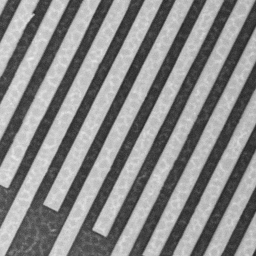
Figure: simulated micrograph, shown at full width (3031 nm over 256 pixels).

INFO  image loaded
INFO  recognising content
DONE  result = parallel lines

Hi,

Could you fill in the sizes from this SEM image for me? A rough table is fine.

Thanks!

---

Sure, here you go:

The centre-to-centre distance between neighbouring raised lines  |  327 nanometres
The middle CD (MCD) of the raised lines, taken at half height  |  0.181 microns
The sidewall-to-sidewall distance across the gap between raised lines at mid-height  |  147 nanometers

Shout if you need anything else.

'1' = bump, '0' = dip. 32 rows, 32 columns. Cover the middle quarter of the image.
10001111100011110000111100001111
10001111000011110001111000011110
00011111000111100001111000011110
00011110000111100011111000111100
00111110001111000011110000111100
00111100001111000111110001111000
01111100011110000111100001111000
01111000011110001111100011110000
11111000111100001111000011110001
11110000111100011111000111100001
11110001111000011110000111100011
11100001111000111110001111000011
11100011110000111100001111000111
11000011110001111000011110000111
11000111110001111000011110001111
10000111100011111000111100001111
10001111100011110000111100011111
00001111000111110001111000011110
00011111000111100001111000111110
00011110001111100011110000111100
00111110001111000011110001111100
00111100011111000111100001111000
01111100011110000111100011111000
01111000111110001111000011110000
11111000111100001111000111110001
11110001111100011110000111100001
11110001111000011110001111100011
11100011111000111100001111000011
11100011110000111100011111000111
11000111110001111000011110000111
11000111100001111000111110001111
10001111100011110000111100001111